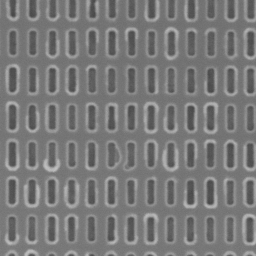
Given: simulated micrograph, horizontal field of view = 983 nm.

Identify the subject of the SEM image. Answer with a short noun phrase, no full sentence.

a regular array of holes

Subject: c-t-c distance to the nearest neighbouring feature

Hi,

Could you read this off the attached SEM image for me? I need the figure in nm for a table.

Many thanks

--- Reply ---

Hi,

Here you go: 75